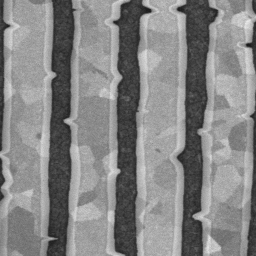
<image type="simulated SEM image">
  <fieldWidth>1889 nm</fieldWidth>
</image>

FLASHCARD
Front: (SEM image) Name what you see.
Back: one or a few lines or trenches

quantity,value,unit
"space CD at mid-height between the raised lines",0.205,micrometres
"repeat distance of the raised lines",498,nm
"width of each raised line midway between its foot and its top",0.292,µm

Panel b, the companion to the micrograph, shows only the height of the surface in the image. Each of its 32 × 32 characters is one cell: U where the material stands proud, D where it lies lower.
DUUUUUDDDDUUUUUDDDUUUUDDDDDUUUUD
DUUUUUDDDDUUUUDDDDDUUUDDDDDUUUUD
DUUUUUDDDDUUUUDDDDUUUUUDDDDUUUUU
DUUUUUDDDDUUUUDDDDUUUUUDDDDUUUUD
DUUUUUDDDDUUUUDDDDUUUUUDDDDUUUUD
DUUUUUDDDUUUUUDDDDUUUUUDDDDUUUUD
DUUUUUDDDUUUUUDDDDUUUUUDDDUUUUUD
DUUUUUDDDUUUUUDDDDUUUUUDDDUUUUUD
DUUUUUDDDUUUUUDDDDUUUUUDDDUUUUUD
DUUUUUDDDUUUUUUDDDUUUUUDDDUUUUUD
DUUUUUDDDUUUUUDDDDUUUUUDDDUUUUUD
DUUUUUDDDUUUUUDDDDUUUUUDDDUUUUUD
DUUUUUDDDUUUUUDDDDUUUUUDDDUUUUUD
DUUUUUDDDUUUUUDDDDUUUUUDDDUUUUUD
DUUUUUDDDUUUUUDDDUUUUUUDDDUUUUUD
DUUUUUDDDUUUUUDDDUUUUUUDDDUUUUUD
DUUUUUDDDUUUUUDDDUUUUUUDDDUUUUUD
DUUUUUDDDUUUUUDDDUUUUUUDDDUUUUUD
DUUUUUDDDUUUUUDDDUUUUUDDDDUUUUUD
UUUUUUDDDUUUUUDDDDUUUUDDDDUUUUUD
DUUUUUDDDDUUUUDDDDUUUUDDDDUUUUUD
DUUUUDDDDDUUUUDDDDUUUUUDDDUUUUUD
DUUUUDDDDDUUUUDDDDUUUUUDDDUUUUUD
DUUUUUDDDUUUUUDDDDUUUUUDDDUUUUUD
DUUUUUDDDUUUUUDDDDUUUUDDDDUUUUUD
UUUUUUDDDUUUUUDDDDUUUUDDDDUUUUUD
UUUUUUDDDUUUUUDDDDUUUUDDDDUUUUUD
UUUUUDDDDUUUUUDDDUUUUUDDDUUUUUUD
DUUUUDDDDUUUUUDDDDUUUUDDDDUUUUUD
UUUUUUDDDUUUUUDDDUUUUUDDDDUUUUUD
UUUUUUDDDUUUUUDDDDUUUUDDDDUUUUUD
UUUUUDDDDUUUUUDDDDUUUUDDDDUUUUDD